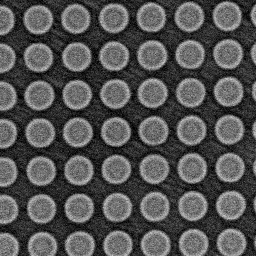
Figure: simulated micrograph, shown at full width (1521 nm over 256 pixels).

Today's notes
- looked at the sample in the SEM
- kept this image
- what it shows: an array of small figures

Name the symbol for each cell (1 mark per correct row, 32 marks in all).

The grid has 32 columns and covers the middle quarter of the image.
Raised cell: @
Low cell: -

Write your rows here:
@@@@@@----@@@@@----@@@@@@----@@@
--@@@------@@@------------------
--------------------------------
--------------------------------
--@@@------@@@@-----@@@@-----@@@
@@@@@@----@@@@@@---@@@@@@----@@@
@@@@@@@--@@@@@@@---@@@@@@@--@@@@
@@@@@@@--@@@@@@@---@@@@@@@--@@@@
@@@@@@@--@@@@@@@---@@@@@@@--@@@@
@@@@@@----@@@@@@---@@@@@@----@@@
-@@@@------@@@@-----@@@@------@@
--------------------------------
--------------------------------
---@--------@@-------@@@------@@
-@@@@@----@@@@@@----@@@@@----@@@
@@@@@@@---@@@@@@---@@@@@@@--@@@@
@@@@@@@--@@@@@@@@--@@@@@@@--@@@@
@@@@@@@--@@@@@@@@--@@@@@@@--@@@@
@@@@@@@---@@@@@@---@@@@@@@---@@@
-@@@@@----@@@@@@----@@@@@-----@@
--@@@-----------------@@--------
--------------------------------
--------------------------------
--@@@@-----@@@@-----@@@@@----@@@
-@@@@@@---@@@@@@---@@@@@@@---@@@
@@@@@@@---@@@@@@@--@@@@@@@---@@@
@@@@@@@---@@@@@@@--@@@@@@@---@@@
@@@@@@@---@@@@@@@--@@@@@@@---@@@
-@@@@@@---@@@@@@----@@@@@----@@@
--@@@@-----@@@@------@@@-------@
--------------------------------
--------------------------------